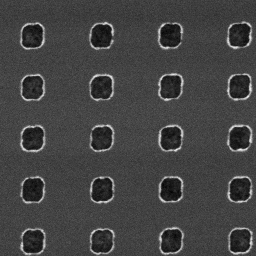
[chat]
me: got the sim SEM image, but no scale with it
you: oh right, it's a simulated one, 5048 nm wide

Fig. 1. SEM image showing a regular array of holes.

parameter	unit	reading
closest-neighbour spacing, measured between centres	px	51.2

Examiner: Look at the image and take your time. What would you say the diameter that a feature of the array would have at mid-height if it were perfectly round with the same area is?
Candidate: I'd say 24.3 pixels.